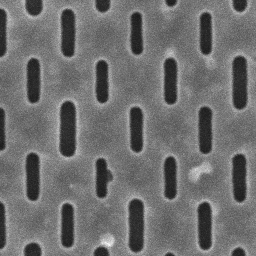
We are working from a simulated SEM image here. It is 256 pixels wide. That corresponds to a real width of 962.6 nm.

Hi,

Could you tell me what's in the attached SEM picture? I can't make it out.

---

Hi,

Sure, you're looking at a regular array of holes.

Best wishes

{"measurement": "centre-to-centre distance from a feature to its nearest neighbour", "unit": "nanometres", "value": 220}